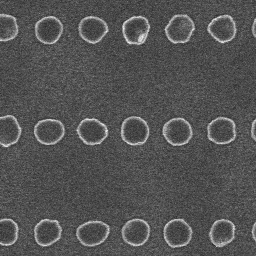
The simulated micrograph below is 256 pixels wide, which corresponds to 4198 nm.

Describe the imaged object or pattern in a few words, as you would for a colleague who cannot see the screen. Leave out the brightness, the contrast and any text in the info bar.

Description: a regular array of raised bodies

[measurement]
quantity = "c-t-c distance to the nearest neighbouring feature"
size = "704 nm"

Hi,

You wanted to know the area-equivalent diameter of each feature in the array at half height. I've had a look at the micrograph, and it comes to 443 nanometers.